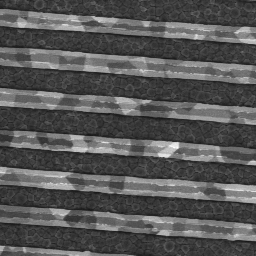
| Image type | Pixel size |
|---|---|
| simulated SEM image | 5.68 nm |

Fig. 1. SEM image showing parallel lines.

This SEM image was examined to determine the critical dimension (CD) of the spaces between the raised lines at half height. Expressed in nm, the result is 139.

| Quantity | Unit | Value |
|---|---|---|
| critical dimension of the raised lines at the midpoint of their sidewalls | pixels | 14.1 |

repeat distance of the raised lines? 222 nm